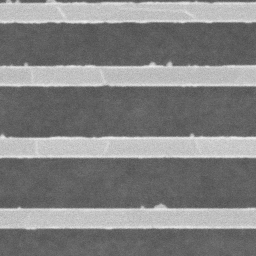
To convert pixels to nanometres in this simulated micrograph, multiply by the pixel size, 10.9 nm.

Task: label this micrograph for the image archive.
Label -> lines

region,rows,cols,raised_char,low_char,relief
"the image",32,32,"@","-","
@@@@@@@@@@@@@@@@@@@@@@@@@@@@@@@@
@@@@@@@@@@@@@@@@@@@@@@@@@@@@@@@@
@@@@@@@@@@@@@@@@@@@@@@@@@@@@@@@@
--------------------------------
--------------------------------
--------------------------------
--------------------------------
--------------------------------
@@@@@@@@@@@@@@@@@@@@@@@@@@@@@@@@
@@@@@@@@@@@@@@@@@@@@@@@@@@@@@@@@
@@@@@@@@@@@@@@@@@@@@@@@@@@@@@@@@
--------------------------------
--------------------------------
--------------------------------
--------------------------------
--------------------------------
--------------------------------
@@@@@@@@@@@@@@@@@@@@@@@@@@@@@@@@
@@@@@@@@@@@@@@@@@@@@@@@@@@@@@@@@
@@@@@@@@@@@@@@@@@@@@@@@@@@@@@@@@
--------------------------------
--------------------------------
--------------------------------
--------------------------------
--------------------------------
--------------------------------
@@@@@@@@@@@@@@@@@@@@@@@@@@@@@@@@
@@@@@@@@@@@@@@@@@@@@@@@@@@@@@@@@
---@@--------@------------------
--------------------------------
--------------------------------
--------------------------------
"